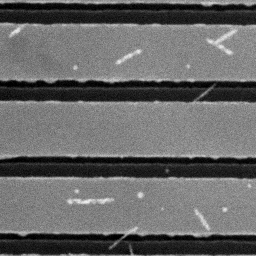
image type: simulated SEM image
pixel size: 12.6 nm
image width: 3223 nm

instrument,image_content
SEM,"lines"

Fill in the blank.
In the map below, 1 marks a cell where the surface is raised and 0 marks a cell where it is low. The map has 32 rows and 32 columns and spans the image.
00000000000000000000000001100000
00000000000000000000000000000000
00000000000000000000000000000000
11111111111111111111111111111111
11111111111111111111111111111111
11111111111111111111111111111111
11111111111111111111111111111111
11111111111111111111111111111111
11111111111111111111111111111111
11111111111111111111111111111111
00000000000000000000000000000000
00000000000000000000000000000000
00000000000000000000000000000000
11111111111111111111111111111111
11111111111111111111111111111111
11111111111111111111111111111111
11111111111111111111111111111111
11111111111111111111111111111111
11111111111111111111111111111111
10110000000011111111111111111111
00000000000000000000000000000000
00000000000000000000000000000000
11111111111111111111111111111111
11111111111111111111111111111111
11111111111111111111111111111111
11111111111111111111111111111111
11111111111111111111111111111111
11111111111111111111111111111111
11111111111111111111111111111111
00000000000000000000000000000000
00000000000000000000000000000000
00000000000000000000000000000000